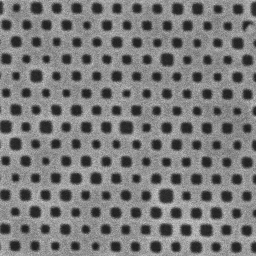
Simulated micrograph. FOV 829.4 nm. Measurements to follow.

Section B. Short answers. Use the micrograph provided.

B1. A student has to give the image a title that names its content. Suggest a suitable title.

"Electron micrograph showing a regular array of holes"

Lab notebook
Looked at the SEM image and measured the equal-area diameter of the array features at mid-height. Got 10.5 pixels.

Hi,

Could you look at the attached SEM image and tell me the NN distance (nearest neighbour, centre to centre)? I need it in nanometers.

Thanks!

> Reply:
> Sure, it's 63.3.